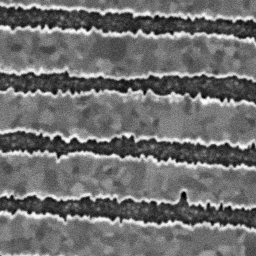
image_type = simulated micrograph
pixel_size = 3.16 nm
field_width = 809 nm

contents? one or a few lines or trenches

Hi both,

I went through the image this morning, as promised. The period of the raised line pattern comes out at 198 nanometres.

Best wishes